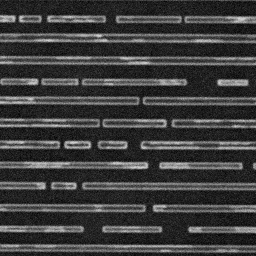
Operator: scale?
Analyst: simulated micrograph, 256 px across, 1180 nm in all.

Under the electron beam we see parallel lines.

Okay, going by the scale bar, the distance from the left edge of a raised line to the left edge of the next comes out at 96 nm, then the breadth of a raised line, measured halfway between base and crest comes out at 0.0305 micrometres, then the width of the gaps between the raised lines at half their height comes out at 68.5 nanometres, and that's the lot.